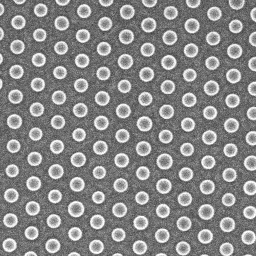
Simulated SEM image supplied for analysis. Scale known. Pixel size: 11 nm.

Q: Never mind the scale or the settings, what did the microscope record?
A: a regular array of raised bodies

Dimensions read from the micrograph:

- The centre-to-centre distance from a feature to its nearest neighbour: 0.271 um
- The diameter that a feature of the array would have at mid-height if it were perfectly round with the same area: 0.143 um